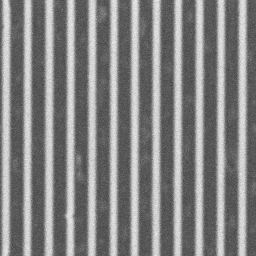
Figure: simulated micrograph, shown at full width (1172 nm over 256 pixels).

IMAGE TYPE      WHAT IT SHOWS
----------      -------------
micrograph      parallel lines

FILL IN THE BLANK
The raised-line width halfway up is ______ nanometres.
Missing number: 28.9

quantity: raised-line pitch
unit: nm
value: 98.3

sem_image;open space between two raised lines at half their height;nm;71